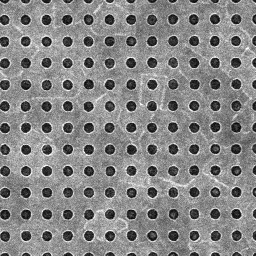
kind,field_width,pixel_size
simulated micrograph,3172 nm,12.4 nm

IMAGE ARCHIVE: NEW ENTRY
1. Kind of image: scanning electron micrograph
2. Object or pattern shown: a regular array of holes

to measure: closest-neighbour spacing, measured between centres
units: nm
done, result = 259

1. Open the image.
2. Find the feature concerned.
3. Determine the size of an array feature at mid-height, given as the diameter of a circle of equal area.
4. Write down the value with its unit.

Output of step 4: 134 nm